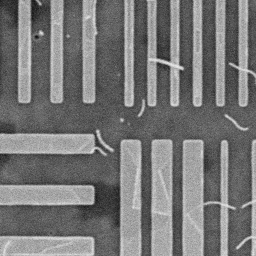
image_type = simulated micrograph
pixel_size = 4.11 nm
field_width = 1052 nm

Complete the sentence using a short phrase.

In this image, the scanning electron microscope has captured groups of lines, slits or small figures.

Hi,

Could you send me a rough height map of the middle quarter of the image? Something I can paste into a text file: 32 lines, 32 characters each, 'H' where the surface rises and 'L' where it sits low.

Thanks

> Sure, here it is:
LLLLLHHLLLLLLLLHHLLLLHHLLLHHHLLL
LLLLLHHLLLLLLLLHHLLLLHHLLLLHHLLL
LLLLLHHLLLLLLLLHHLLLLHHLLLLHHLLL
LLLLLHHLLLLLLLLHHLLLLHHLLLLHHLLL
LLLLLHHLLLLLLLLHHLLLLHHLLLLHHLLL
LLLLLHHLLLLLLLLHHLLLLHHLLLLHHLLL
LLLLLHHLLLLLLLLHHLLLLHHLLLLHHLLL
LLLLLHHLLLLLLLLHHLLLLHHLLLLHLLLL
LLLLLHHLLLLLLLLHHLLLLHHLLLLHLLLL
LLLLLHHLLLLLLLLHHLLLLHHLLLLHLLLL
LLLLLLLLLLLLLLLLLLLLLLLLLLLLLLLL
LLLLLLLLLLLLLLLLLLLLLLLLLLLLLLLL
LLLLLLLLLLLLLLLLLLLLLLLLLLLLLLLL
LLLLLLLLLLLLLLLLLLLLLLLLLLLLLLLL
LLLLLLLLLLLLLLLLLLLLLLLLLLLLLLLL
LLLLLLLLLLLLLLLLLLLLLLLLLLLLLLLL
LLLLLLLLLLLLLLLLLLLLLLLLLLLLLLLL
LLLLLLLLLLLLLLLLLLLLLLLLLLLLLLLL
HHHHHHHLLLLLLLLLLLLLLLLLLLLLLLLL
HHHHHHHLLLLLLLLHHHHLLLHHHHHLLLHH
HHHHHHHHLLLLLLHHHHHLLLHHHHHLLLHH
HHHHHHHHLLLLLLHHHHHLLLHHHHHLLLHH
LLLLLLLLLLLLLLHHHHHLLLHHHHHLLLHH
LLLLLLLLLLLLLLHHHHHLLLHHHHHLLLHH
LLLLLLLLLLLLLLHHHHHLLLHHHHHLLLHH
LLLLLLLLLLLLLLHHHHHLLLHHHHHLLLHH
LLLLLLLLLLLLLLHHHHHLLLHHHHHLLLHH
LLLLLLLLLLLLLLHHHHHLLLHHHHHLLLHH
LLLLLLLLLLLLLLHHHHHLLLHHHHHLLLHH
LLLLLLLLLLLLLLHHHHHLLLHHHHHLLLHH
LLLLLLLLLLLLLLHHHHHLLLHHHHHLLLHH
HHHHHHHLLLLLLLHHHHHLLLHHHHHLLLHH